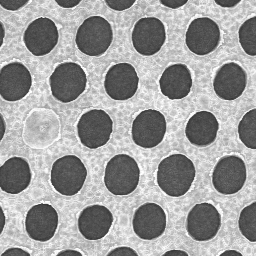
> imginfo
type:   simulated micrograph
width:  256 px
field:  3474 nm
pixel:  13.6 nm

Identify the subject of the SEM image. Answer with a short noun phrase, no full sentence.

a regular array of holes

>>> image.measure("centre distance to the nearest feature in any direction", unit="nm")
722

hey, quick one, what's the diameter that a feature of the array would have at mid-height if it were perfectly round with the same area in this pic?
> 495 nanometers